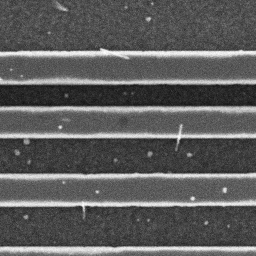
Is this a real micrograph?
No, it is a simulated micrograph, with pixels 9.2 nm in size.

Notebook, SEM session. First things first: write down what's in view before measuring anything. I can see lines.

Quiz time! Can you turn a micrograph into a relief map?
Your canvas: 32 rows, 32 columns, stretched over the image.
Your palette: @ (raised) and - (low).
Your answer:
--------------------------------
--------------------------------
--------------------------------
--------------------------------
--------------------------------
--------------------------------
---------@-@@@@@-----@-----@@@@@
@@@@@@@@@@@@@@@@@@@@@@@@@@@@@@@@
@@@@@@@@@@@@@@@@@@@@@@@@@@@@@@@@
@@@@@@@@@@@@@@@@@@@@@@@@@@@@@@@@
@@@@---------------------@@-----
--------------------------------
--------------------------------
@@@@@@@@@@@@@@@@@@@@@@@@@@@@@@@@
@@@@@@@@@@@@@@@@@@@@@@@@@@@@@@@@
@@@@@@@@@@@@@@@@@@@@@@@@@@@@@@@@
@@@@@@@@@@@@@@@@@@@@@@@@@@@@@@@@
--------------------------------
--------------------------------
--------------------------------
--------------------------------
--------------------------------
@@@@@@@@@@@@@@@@@@@@@@@@@@@@@@@@
@@@@@@@@@@@@@@@@@@@@@@@@@@@@@@@@
@@@@@@@@@@@@@@@@@@@@@@@@@@@@@@@@
@@@@@@@@@@@@@@@@@@@@@@@@@@@@@@@@
--------------------------------
--------------------------------
--------------------------------
--------------------------------
--------------------------------
@@@@@@@@@@@@@@@@@@@@@@@@@@@@@@@@